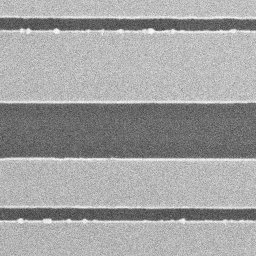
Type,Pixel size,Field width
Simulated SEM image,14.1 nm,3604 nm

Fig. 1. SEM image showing lines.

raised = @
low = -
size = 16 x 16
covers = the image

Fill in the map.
@@@@@@@@@@@@@@@@
@@@@@@@@@@@@@@@@
@@@@@@@@@@@@@@@@
@@@@@@@@@@@@@@@@
@@@@@@@@@@@@@@@@
@@@@@@@@@@@@@@@@
----------------
----------------
----------------
----------------
@@@@@@@@@@@@@@@@
@@@@@@@@@@@@@@@@
@@@@@@@@@@@@@@@@
@@@@@@@@@@@@@@@@
@@@@@@@@@@@@@@@@
@@@@@@@@@@@@@@@@